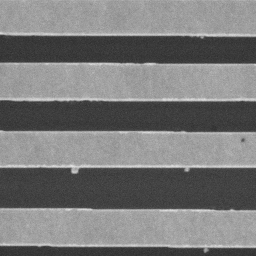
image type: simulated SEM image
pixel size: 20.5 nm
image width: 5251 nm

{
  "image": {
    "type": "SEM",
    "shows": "lines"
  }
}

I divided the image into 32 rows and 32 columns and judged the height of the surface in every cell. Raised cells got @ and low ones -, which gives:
@@@@@@@@@@@@@@@@@@@@@@@@@@@@@@@@
@@@@@@@@@@@@@@@@@@@@@@@@@@@@@@@@
@@@@@@@@@@@@@@@@@@@@@@@@@@@@@@@@
@@@@@@@@@@@@@@@@@@@@@@@@@@@@@@@@
------------------------@@@@@@@@
--------------------------------
--------------------------------
--------------------------------
@@@@@@@@@@@@@@@@@@@@@@@@@@@@@@@@
@@@@@@@@@@@@@@@@@@@@@@@@@@@@@@@@
@@@@@@@@@@@@@@@@@@@@@@@@@@@@@@@@
@@@@@@@@@@@@@@@@@@@@@@@@@@@@@@@@
-@-@@--@------@@@@@@@@@@@@@@@@-@
--------------------------------
--------------------------------
--------------------------------
@@@@@@@@@@@@@@@@@@@@@@@@--------
@@@@@@@@@@@@@@@@@@@@@@@@@@@@@@@@
@@@@@@@@@@@@@@@@@@@@@@@@@@@@@@@@
@@@@@@@@@@@@@@@@@@@@@@@@@@@@@@@@
@@@@@@@@@@@@@@@@@@@@@@@@@@@@@@@@
--------------------------------
--------------------------------
--------------------------------
--------------------------------
--------------------------------
@@@@@@@@@@@@@@@@@@@@@@@@@@@@@@@@
@@@@@@@@@@@@@@@@@@@@@@@@@@@@@@@@
@@@@@@@@@@@@@@@@@@@@@@@@@@@@@@@@
@@@@@@@@@@@@@@@@@@@@@@@@@@@@@@@@
@@@@@@@@@@@@@@@@@@@@@@@@@@@@@@@@
--------------------------------